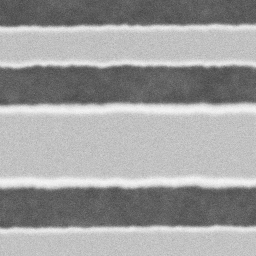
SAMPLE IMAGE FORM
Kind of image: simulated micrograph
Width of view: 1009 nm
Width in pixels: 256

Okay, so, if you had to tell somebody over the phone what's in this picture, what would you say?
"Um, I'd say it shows lines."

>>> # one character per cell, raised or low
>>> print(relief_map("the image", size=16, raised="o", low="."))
................
................
oooooooooooooooo
oooooooooooooooo
................
................
................
oooooooooooooooo
oooooooooooooooo
oooooooooooooooo
oooooooooooooooo
ooooooooooo..ooo
................
................
oooooooooooooooo
oooooooooooooooo